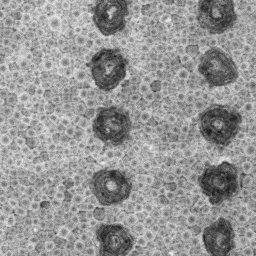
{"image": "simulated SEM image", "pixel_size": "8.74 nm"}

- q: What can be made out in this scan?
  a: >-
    ring-shaped raised bodies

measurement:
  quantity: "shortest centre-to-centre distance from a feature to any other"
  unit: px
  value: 57.1